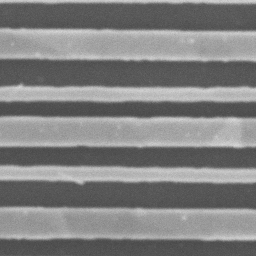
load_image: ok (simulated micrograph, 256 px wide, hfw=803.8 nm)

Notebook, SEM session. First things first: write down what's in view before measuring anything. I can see lines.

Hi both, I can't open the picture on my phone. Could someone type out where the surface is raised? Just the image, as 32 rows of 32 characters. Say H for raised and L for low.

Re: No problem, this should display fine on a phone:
LLLLLLLLLLLLLLLLLLLLLLLLLLLLLLLL
LLLLLLLLLLLLLLLLLLLLLLLLLLLLLLLL
LLLLLLLLLLLLLLLLLLLLLLLLLLLLLLLL
LLLLLLLLLLLLLLLLLLLLLLLLLLLLLLLL
HHHHHHHHHHHHHHHHHHHHHHHHHHHHHHHH
HHHHHHHHHHHHHHHHHHHHHHHHHHHHHHHH
HHHHHHHHHHHHHHHHHHHHHHHHHHHHHHHH
LLLLLLLLLLLLLLLLLLLLLLLLLHLHHLLH
LLLLLLLLLLLLLLLLLLLLLLLLLLLLLLLL
LLLLLLLLLLLLLLLLLLLLLLLLLLLLLLLL
LLLLLLLLLLLLLLLLLLLLLLLLLLLLLLLL
HHHHHHHHHHHHHHHHHHHHHHHHHHHHHHHH
HHHHHHHHHHHHHHHHHHHHHHHHHHHHHHHH
LLLLLLLLLLLLLLLLLLLLLLLLLLLLLLLL
LLLLLLLLLLLLLLLLLLLLLLLLLLLLLLLL
HHHHHHHHHHHHHHHHHHHHHHHHHHHHHHHH
HHHHHHHHHHHHHHHHHHHHHHHHHHHHHHHH
HHHHHHHHHHHHHHHHHHHHHHHHHHHHHHHH
LLLLLLLLLLLLLLLLLLLLLLLLLLLLLLLL
LLLLLLLLLLLLLLLLLLLLLLLLLLLLLLLL
LLLLLLLLLLLLLLLLLLLLLLLLLLLLLLLL
HHHHHHHHHHHHHHHHHHHHHHHHHHHHHHHH
LLLLLLLLHHHHHLHHHHHHHHHHHHHHHHHH
LLLLLLLLLLLLLLLLLLLLLLLLLLLLLLLL
LLLLLLLLLLLLLLLLLLLLLLLLLLLLLLLL
LLLLLLLLLLLLLLLLLLLLLLLLLLLLLLLL
HHHHHHHHHHHHHHHHHHHHHHHHHHHHHHHH
HHHHHHHHHHHHHHHHHHHHHHHHHHHHHHHH
HHHHHHHHHHHHHHHHHHHHHHHHHHHHHHHH
HHHHHHHHHHHHHHHHHHHHHHHHHHHHHHHH
LLLLLLLLLLLLLLLLLLLLLLLLLLLLLLLL
LLLLLLLLLLLLLLLLLLLLLLLLLLLLLLLL